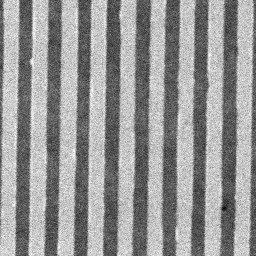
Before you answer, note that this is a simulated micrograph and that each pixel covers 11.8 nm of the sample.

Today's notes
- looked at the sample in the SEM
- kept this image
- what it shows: parallel lines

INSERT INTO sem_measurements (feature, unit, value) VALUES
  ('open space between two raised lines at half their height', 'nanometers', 178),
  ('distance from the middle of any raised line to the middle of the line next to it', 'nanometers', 345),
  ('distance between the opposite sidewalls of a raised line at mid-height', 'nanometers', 166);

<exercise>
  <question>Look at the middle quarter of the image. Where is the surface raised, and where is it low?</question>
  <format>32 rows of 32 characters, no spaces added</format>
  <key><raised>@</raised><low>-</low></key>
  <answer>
@@@----@@@----@@@@----@@@----@@@
@@@----@@@----@@@@----@@@----@@@
@@@----@@@----@@@@----@@@----@@@
@@@----@@@----@@@@----@@@----@@@
@@@----@@@----@@@@----@@@----@@@
@@@----@@@----@@@@----@@@----@@@
@@@----@@@----@@@@----@@@----@@@
@@@----@@@----@@@@----@@@----@@@
@@@----@@@----@@@@----@@@----@@@
@@@----@@@----@@@-----@@@----@@@
@@@----@@@----@@@----@@@@----@@@
@@@----@@@----@@@----@@@@----@@@
@@@----@@@----@@@----@@@@----@@@
@@@----@@@----@@@----@@@@----@@@
@@@----@@@----@@@----@@@@----@@@
@@@----@@@----@@@----@@@@----@@@
@@@----@@@----@@@----@@@@----@@@
@@@----@@@----@@@----@@@@----@@@
@@@---@@@@----@@@----@@@@----@@@
@@@---@@@@----@@@----@@@@----@@@
@@@---@@@@----@@@----@@@@----@@@
@@@---@@@@----@@@@---@@@@----@@@
@@@----@@@----@@@@---@@@@----@@@
@@@----@@@----@@@@---@@@@----@@@
@@@---@@@@----@@@----@@@@----@@@
@@@---@@@@----@@@----@@@@----@@@
@@@---@@@@----@@@----@@@@----@@@
@@@---@@@@----@@@----@@@@----@@@
@@@---@@@@----@@@----@@@@----@@@
@@@----@@@----@@@----@@@@----@@@
@@@---@@@@----@@@----@@@-----@@@
@@@---@@@@----@@@----@@@----@@@@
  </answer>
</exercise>